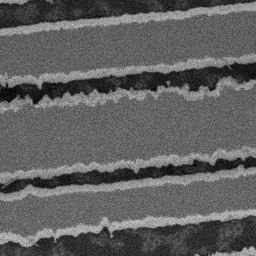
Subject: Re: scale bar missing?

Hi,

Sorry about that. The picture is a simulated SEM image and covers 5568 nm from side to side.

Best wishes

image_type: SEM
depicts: one or a few lines or trenches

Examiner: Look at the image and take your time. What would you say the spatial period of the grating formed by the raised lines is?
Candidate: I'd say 1.73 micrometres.